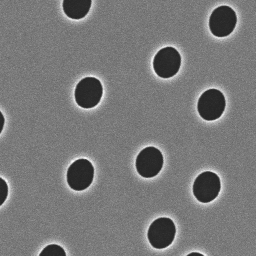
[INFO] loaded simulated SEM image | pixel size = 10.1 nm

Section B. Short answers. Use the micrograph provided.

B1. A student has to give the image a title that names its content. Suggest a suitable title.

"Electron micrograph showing a regular array of holes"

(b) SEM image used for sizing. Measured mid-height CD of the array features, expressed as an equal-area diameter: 301 nanometres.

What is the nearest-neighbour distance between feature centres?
643 nm